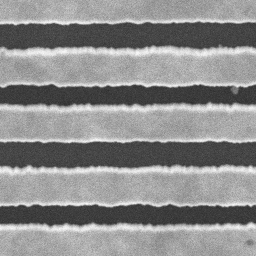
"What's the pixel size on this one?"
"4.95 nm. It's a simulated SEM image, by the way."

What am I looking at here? lines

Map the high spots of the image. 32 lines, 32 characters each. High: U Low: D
UUUUUUUUUUUUUUUUUUUUUUUUUUUUUUUU
UUUUUUUUUUUUUUUUUUUUUUUUUUUUUUUU
UUUUUUUUUUUUUUUUUUUUUUUUUUUUUUUU
DDDDDDDDDDDDDDDDDDDDDDDDDDDDDDDD
DDDDDDDDDDDDDDDDDDDDDDDDDDDDDDDD
DDDDDDDDDDDDDDDDDDDDDDDDDDDDDDDD
UUUUUUUUUUUUUUUUUUUUUUUUUUUUUUUU
UUUUUUUUUUUUUUUUUUUUUUUUUUUUUUUU
UUUUUUUUUUUUUUUUUUUUUUUUUUUUUUUU
UUUUUUUUUUUUUUUUUUUUUUUUUUUUUUUU
UUUUUUUUUUUUUUUUUUUUUUUUUUUUUUUU
DDDDDDDDDDDDDDDDDDDDDDDDDDDDDDDD
DDDDDDDDDDDDDDDDDDDDDDDDDDDDDDDD
UUUUUUUUUUUUUUUUUUUUUUUUUUUUUUUU
UUUUUUUUUUUUUUUUUUUUUUUUUUUUUUUU
UUUUUUUUUUUUUUUUUUUUUUUUUUUUUUUU
UUUUUUUUUUUUUUUUUUUUUUUUUUUUUUUU
UUUUUUUUUUUUUUUUUUUUUUUUUUUUUUUU
DDDDDDDDDDDDDDDDDDDDDDDDDDDDDDDD
DDDDDDDDDDDDDDDDDDDDDDDDDDDDDDDD
DDDDDDDDDDDDDDDDDDDDDDDDDDDDDDDD
UUUUUUUUUUUUUUUUUUUUUUUUUUUUUUUU
UUUUUUUUUUUUUUUUUUUUUUUUUUUUUUUU
UUUUUUUUUUUUUUUUUUUUUUUUUUUUUUUU
UUUUUUUUUUUUUUUUUUUUUUUUUUUUUUUU
UUUUUUUUUUUUUUUUUUUUUUUUUUUUUUUU
DDDDDDDDDDDDDDDDDDDDDDDDDDDDDDDD
DDDDDDDDDDDDDDDDDDDDDDDDDDDDDDDD
UUUUUUUUUUUUUUUUUUUUUUUUUUUUUUUU
UUUUUUUUUUUUUUUUUUUUUUUUUUUUUUUU
UUUUUUUUUUUUUUUUUUUUUUUUUUUUUUUU
UUUUUUUUUUUUUUUUUUUUUUUUUUUUUUUU